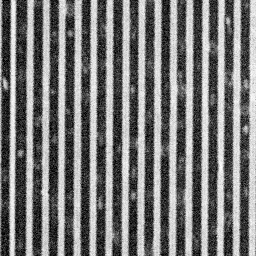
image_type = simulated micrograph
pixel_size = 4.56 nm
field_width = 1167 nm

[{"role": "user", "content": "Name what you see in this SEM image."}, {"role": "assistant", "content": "parallel lines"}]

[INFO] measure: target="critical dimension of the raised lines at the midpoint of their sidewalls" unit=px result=6.01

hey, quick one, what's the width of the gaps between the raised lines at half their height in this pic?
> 0.0468 µm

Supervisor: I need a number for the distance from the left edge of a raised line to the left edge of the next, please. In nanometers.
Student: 73